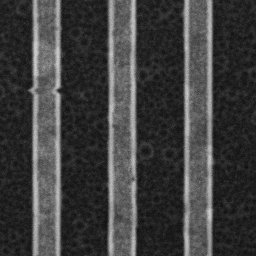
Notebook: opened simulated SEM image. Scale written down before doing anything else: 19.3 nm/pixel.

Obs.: one or a few lines or trenches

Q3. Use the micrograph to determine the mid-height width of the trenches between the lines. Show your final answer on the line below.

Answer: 1040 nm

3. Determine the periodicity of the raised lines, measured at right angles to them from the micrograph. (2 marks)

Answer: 1470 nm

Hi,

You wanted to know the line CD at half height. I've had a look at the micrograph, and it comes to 432 nm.